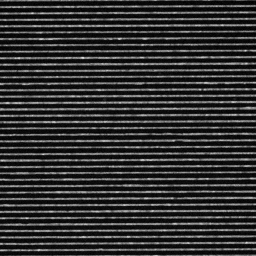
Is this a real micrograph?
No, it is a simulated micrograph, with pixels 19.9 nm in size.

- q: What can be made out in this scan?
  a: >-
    parallel lines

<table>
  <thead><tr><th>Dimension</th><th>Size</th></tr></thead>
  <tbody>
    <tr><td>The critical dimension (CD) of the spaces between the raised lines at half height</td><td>99.7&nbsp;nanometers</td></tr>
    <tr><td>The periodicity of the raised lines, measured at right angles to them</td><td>128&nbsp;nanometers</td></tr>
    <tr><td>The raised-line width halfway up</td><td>1.5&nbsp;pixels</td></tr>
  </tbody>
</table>